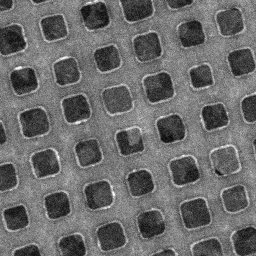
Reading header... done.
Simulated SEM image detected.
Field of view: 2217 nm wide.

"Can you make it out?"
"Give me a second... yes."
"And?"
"a regular array of raised bodies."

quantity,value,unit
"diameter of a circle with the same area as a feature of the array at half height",254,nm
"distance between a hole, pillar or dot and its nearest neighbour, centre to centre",366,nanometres